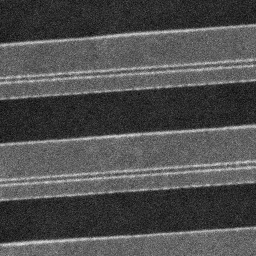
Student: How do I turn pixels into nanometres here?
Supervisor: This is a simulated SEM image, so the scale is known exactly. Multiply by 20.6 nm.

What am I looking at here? lines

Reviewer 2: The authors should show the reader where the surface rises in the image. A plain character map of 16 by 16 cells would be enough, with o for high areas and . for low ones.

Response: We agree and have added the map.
................
................
....oooooooooooo
oooooooooooooooo
oooooooooooooooo
oooooooooo......
................
................
........oooooooo
oooooooooooooooo
oooooooooooooooo
ooooooooooooooo.
o...............
................
............oooo
oooooooooooooooo